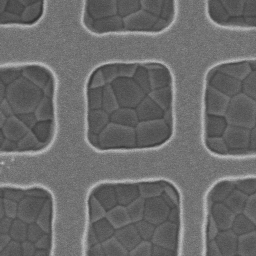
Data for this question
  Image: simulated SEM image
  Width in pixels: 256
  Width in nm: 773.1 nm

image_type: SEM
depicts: holes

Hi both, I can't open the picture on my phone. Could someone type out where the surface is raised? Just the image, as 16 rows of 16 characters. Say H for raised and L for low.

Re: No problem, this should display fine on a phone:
LLLHHLLLLLLHHLLL
LLHHHLLLLLLHHHLL
HHHHHHHHHHHHHHHH
HHHHHHHHHHHHHHHH
LLLHHHLLLLLHHLLL
LLLHHLLLLLLHHLLL
LLLHHLLLLLLHHLLL
LLLHHLLLLLLHHLLL
LLLHHHLLLLLHHLLL
LHHHHHHHHHHHHLLL
HHHHHHHHHHHHHHHH
HHHHHHLLLLLHHHLL
LLLHHLLLLLLHHLLL
LLLHHLLLLLLHHLLL
LLLHHLLLLLLHHLLL
LLLHHLLLLLLHHLLL